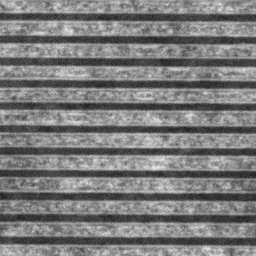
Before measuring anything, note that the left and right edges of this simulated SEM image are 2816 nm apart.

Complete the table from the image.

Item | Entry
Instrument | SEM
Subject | parallel lines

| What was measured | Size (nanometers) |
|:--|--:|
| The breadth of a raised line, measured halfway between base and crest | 144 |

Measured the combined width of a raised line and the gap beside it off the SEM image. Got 246 nm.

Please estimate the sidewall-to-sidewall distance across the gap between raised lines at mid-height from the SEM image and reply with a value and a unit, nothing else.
0.104 microns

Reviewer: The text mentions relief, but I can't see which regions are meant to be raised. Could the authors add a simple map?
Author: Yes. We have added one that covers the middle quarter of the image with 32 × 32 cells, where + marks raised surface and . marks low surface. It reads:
................................
+++++++++++++++++++++++++++++.++
++++++++++++++++++++++++++++++++
++++++++++++++++++++++++++++++++
................................
................................
++++++++++++++++++++++++++++++++
++++++++++++++++++++++++++++++++
++++++++++++++++++++++++++++++++
............................++++
................................
................................
++++++++++++++++++++++++++++++++
++++++++++++++++++++++++++++++++
++++++++++++++++++++++++++++++++
................................
................................
................................
++++++++++++++++++++++++++++++++
++++++++++++++++++++++++++++++++
........++++++++++++++++++++++++
................................
................................
++++++++++++++++++++++++++++++++
++++++++++++++++++++++++++++++++
+++++++++++++++++++++++.++++++++
...........................+.+..
................................
................................
++++++++++++++++++++++++++++++++
++++++++++++++++++++++++++++++++
++++++++++++++++++++++++++++++++